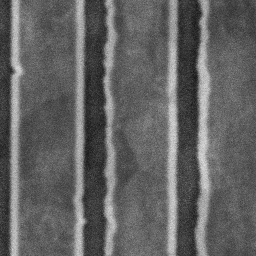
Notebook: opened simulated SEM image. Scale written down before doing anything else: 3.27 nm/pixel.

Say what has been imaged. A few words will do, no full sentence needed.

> one or a few lines or trenches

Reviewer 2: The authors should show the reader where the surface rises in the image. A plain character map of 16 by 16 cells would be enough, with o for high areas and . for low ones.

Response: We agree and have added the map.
.oooo..oooo..ooo
.oooo..oooo..ooo
.oooo..oooo..ooo
.oooo..oooo..ooo
.oooo..oooo..ooo
.oooo..oooo..ooo
.oooo..oooo..ooo
.oooo..oooo..ooo
.oooo..oooo..ooo
.oooo..oooo..ooo
.oooo..oooo..ooo
.oooo..oooo..ooo
.oooo..oooo..ooo
.oooo..oooo..ooo
.oooo..oooo..ooo
.oooo..oooo..ooo